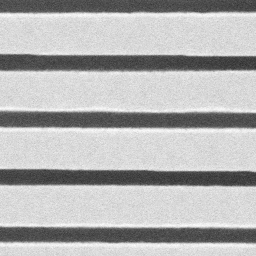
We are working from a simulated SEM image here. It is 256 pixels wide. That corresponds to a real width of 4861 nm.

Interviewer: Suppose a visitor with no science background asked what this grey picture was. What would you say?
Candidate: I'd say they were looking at lines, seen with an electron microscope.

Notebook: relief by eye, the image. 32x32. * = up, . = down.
................................
................................
********************************
********************************
********************************
********************************
********************************
................................
................................
********************************
********************************
********************************
********************************
********************************
................................
................................
********************************
********************************
********************************
********************************
********************************
................................
................................
********************************
********************************
********************************
********************************
********************************
................................
................................
********************************
********************************